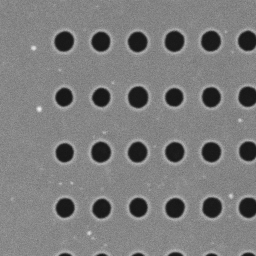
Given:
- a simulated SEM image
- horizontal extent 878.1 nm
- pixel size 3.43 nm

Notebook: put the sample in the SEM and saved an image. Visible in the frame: a regular array of holes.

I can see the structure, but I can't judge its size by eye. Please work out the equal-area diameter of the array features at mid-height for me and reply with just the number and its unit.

68.4 nanometres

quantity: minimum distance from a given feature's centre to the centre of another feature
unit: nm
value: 126